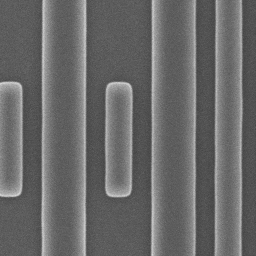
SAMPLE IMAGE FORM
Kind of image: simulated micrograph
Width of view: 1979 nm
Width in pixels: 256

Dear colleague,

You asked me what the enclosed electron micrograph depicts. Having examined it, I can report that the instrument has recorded groups of lines, slits or small figures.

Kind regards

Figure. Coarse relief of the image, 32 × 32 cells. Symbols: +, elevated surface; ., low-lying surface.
.....++++++........+++++...+++..
.....++++++........+++++...+++..
.....++++++........+++++...+++..
.....++++++........+++++...+++..
.....++++++........+++++...+++..
.....++++++........+++++...+++..
.....++++++........+++++...+++..
.....++++++........+++++...+++..
.....++++++........+++++...+++..
.....++++++........+++++...+++..
++...++++++...++...+++++...+++..
+++..++++++..+++...+++++...+++..
+++..++++++..+++...+++++...+++..
+++..++++++..+++...+++++...+++..
+++..++++++..+++...+++++...+++..
+++..++++++..+++...+++++...+++..
+++..++++++..+++...+++++...+++..
+++..++++++..+++...+++++...+++..
+++..++++++..+++...+++++...+++..
+++..++++++..+++...+++++...+++..
+++..++++++..+++...+++++...+++..
+++..++++++..+++...+++++...+++..
+++..++++++..+++...+++++...+++..
+++..++++++..+++...+++++...+++..
++...++++++...++...+++++...+++..
.....++++++........+++++...+++..
.....++++++........+++++...+++..
.....++++++........+++++...+++..
.....++++++........+++++...+++..
.....++++++........+++++...+++..
.....++++++........+++++...+++..
.....++++++........+++++...+++..